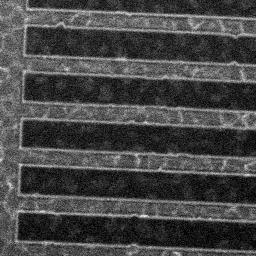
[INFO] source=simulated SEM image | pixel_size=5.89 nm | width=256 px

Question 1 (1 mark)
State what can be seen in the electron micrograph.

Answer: parallel lines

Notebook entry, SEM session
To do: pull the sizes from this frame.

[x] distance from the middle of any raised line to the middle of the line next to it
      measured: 274 nanometers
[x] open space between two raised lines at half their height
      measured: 91.9 nm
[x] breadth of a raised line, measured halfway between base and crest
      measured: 183 nanometers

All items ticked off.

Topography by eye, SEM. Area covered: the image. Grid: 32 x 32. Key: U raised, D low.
DDDUUUUUUUUUUUUUUUUUUUUUUUUUUUUU
DDDDDDDDDDDDDUUUUUUUUUUUUUUUUUUU
DDDDDDDDDDDDDDDDDDDDDDDDDDDDDDDD
DDDUUUUUUUUUDDDDDDDDDDDDDDDDDDDD
DDDUUUUUUUUUUUUUUUUUUUUUUUUUUUUU
DDDUUUUUUUUUUUUUUUUUUUUUUUUUUUUU
DDDUUUUUUUUUUUUUUUUUUUUUUUUUUUUU
DDDDDDDDDDDDDDDDUUUUUUUUUUUUUUUU
DDDDDDDDDDDDDDDDDDDDDDDDDDDDDDDD
DDDUUUUUUUUUUUUDDDDDDDDDDDDDDDDD
DDDUUUUUUUUUUUUUUUUUUUUUUUUUUUUU
DDDUUUUUUUUUUUUUUUUUUUUUUUUUUUUU
DDDUUUUUUUUUUUUUUUUUUUUUUUUUUUUU
DDDDDDDDDDDDDDDDDDDDUUUUUUUUUUUU
DDDDDDDDDDDDDDDDDDDDDDDDDDDDDDDD
DDDUUUUUUUUUUUUUUUUUDDDDDDDDDDDD
DDDUUUUUUUUUUUUUUUUUUUUUUUUUUUUU
DDDUUUUUUUUUUUUUUUUUUUUUUUUUUUUU
DDDUUUUUUUUUUUUUUUUUUUUUUUUUUUUU
DDDDDDDDDDDDDDDDDDDDDDDDUUUUUUUU
DDDDDDDDDDDDDDDDDDDDDDDDDDDDDDDD
DDUUUUUUUUUUUUUUUUUUUUDDDDDDDDDD
DDUUUUUUUUUUUUUUUUUUUUUUUUUUUUUU
DDUUUUUUUUUUUUUUUUUUUUUUUUUUUUUU
DDDDUUUUUUUUUUUUUUUUUUUUUUUUUUUU
DDDDDDDDDDDDDDDDDDDDDDDDDDDUUUUU
DDUDUDDDDDDDDDDDDDDDDDDDDDDDDDDD
DDUUUUUUUUUUUUUUUUUUUUUUUUDDDDDD
DDUUUUUUUUUUUUUUUUUUUUUUUUUUUUUU
DDUUUUUUUUUUUUUUUUUUUUUUUUUUUUUU
DDDDDDDUUUUUUUUUUUUUUUUUUUUUUUUU
DDDDDDDDDDDDDDDDDDDDDDDDDDDDUDUU